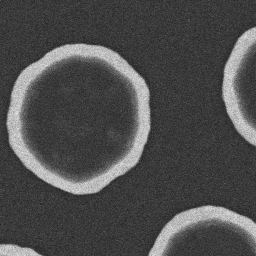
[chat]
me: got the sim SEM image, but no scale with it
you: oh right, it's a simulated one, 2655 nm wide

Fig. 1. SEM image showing raised bodies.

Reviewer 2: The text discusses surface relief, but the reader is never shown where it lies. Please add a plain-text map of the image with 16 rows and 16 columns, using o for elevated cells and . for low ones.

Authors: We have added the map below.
................
................
...............o
...oooo........o
..oooooo......oo
.oooooooo.....oo
.oooooooo.....oo
.oooooooo......o
.oooooooo.......
.oooooooo.......
..oooooo........
....oo..........
................
............oo..
...........ooooo
..........oooooo